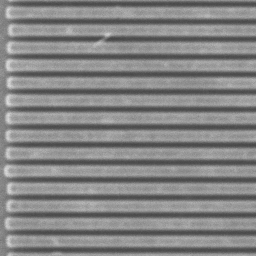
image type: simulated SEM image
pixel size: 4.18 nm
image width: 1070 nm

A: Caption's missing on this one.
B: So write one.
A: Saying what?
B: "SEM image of parallel lines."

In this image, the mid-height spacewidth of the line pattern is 27.1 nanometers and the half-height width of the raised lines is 11.1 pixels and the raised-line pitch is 73.4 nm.